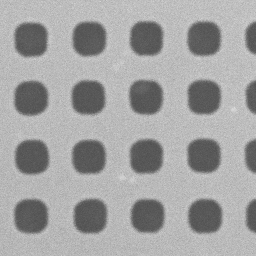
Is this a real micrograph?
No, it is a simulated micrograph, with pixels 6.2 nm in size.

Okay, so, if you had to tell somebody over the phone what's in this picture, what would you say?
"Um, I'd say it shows a regular array of holes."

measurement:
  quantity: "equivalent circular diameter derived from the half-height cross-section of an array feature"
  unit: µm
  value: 0.225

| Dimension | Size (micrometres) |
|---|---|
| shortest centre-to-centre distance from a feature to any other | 0.356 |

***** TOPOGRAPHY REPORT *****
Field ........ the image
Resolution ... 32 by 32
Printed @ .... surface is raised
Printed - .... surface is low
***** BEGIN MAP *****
@@@@@@@@@@@@@@@@@@@@@@@@@@@@@@@@
@@@@@@@@@@@@@@@@@@@@@@@@@@@@@@@@
@@@@@@@@@@@@@@@@@@@@@@@@@@@@@@@@
@@----@@@----@@@----@@@@---@@@@-
@@----@@@----@@@----@@@-----@@@-
@@----@@@----@@@----@@@-----@@@-
@@----@@@@---@@@@---@@@@---@@@@-
@@@@@@@@@@@@@@@@@@@@@@@@@@@@@@@@
@@@@@@@@@@@@@@@@@@@@@@@@@@@@@@@@
@@@@@@@@@@@@@@@@@@@@@@@@@@@@@@@@
@@---@@@@----@@@@---@@@@---@@@@-
@@----@@@----@@@----@@@-----@@@-
@@----@@@----@@@----@@@-----@@@-
@@----@@@----@@@----@@@@---@@@@-
@@@@@@@@@@@@@@@@@@@@@@@@@@@@@@@@
@@@@@@@@@@@@@@@@@@@@@@@@@@@@@@@@
@@@@@@@@@@@@@@@@@@@@@@@@@@@@@@@@
@@@--@@@@@@-@@@@@@-@@@@@---@@@@@
@@----@@@----@@@----@@@-----@@@-
@@----@@@----@@@----@@@-----@@@-
@@----@@@----@@@----@@@----@@@@-
@@@--@@@@@---@@@@---@@@@@--@@@@-
@@@@@@@@@@@@@@@@@@@@@@@@@@@@@@@@
@@@@@@@@@@@@@@@@@@@@@@@@@@@@@@@@
@@@@@@@@@@@@@@@@@@@@@@@@@@@@@@@@
@@----@@@@---@@@@---@@@@---@@@@-
@@----@@@----@@@-----@@@----@@@-
@@----@@@----@@@-----@@@----@@@-
@@----@@@----@@@@---@@@@---@@@@-
@@@@@@@@@@@@@@@@@@@@@@@@@@@@@@@@
@@@@@@@@@@@@@@@@@@@@@@@@@@@@@@@@
@@@@@@@@@@@@@@@@@@@@@@@@@@@@@@@@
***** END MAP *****